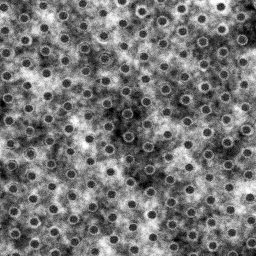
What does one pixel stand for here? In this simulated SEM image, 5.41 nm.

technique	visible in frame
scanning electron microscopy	a regular array of raised bodies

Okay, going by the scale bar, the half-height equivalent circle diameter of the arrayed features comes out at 0.0525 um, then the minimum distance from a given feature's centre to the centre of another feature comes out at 121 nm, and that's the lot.